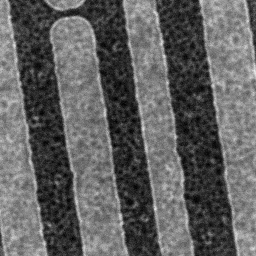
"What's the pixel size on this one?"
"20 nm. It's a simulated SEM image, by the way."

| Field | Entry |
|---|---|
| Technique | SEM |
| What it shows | one or a few lines or trenches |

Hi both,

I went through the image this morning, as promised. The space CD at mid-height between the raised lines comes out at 0.785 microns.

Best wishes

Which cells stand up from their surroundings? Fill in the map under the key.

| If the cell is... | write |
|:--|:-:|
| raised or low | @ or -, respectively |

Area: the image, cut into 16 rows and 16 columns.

-@@@@@@@--@@@--@
-@@@-@@@--@@@---
-@@---@@--@@@---
-@@---@@--@@@---
-@@@--@@--@@@---
-@@@--@@@-@@@---
-@@@--@@@--@@---
--@@---@@--@@@--
--@@---@@--@@@--
--@@---@@--@@@--
--@@@--@@--@@@--
--@@@--@@--@@@--
--@@@--@@@-@@@--
--@@@---@@--@@@-
---@@---@@--@@@-
---@@---@@--@@@-